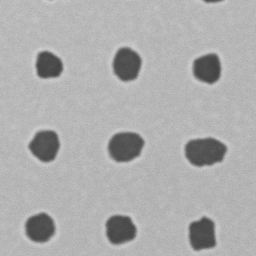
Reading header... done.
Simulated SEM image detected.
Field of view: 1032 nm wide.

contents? a regular array of holes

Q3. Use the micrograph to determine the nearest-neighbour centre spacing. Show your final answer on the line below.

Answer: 324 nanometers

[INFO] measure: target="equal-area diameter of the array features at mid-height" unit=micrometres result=0.124